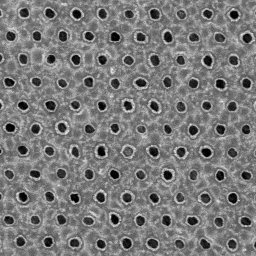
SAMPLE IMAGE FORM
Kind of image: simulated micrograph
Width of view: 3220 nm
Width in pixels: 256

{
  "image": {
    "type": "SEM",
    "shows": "a regular array of holes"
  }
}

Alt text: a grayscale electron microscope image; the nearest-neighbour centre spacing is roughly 320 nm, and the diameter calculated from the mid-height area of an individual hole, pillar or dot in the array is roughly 125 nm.